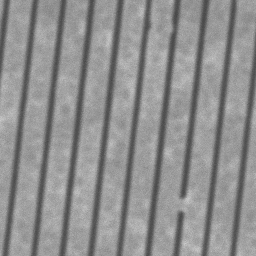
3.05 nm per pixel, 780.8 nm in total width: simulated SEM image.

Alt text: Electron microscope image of parallel lines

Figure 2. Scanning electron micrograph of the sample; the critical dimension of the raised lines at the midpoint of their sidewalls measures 62.5 nanometres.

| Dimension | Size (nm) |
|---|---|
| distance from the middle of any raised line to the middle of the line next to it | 86.2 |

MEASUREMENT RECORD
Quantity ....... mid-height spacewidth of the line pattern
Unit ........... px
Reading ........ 7.8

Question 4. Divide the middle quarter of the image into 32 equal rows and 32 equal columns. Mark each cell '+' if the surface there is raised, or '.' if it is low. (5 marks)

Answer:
++++..+++++..+++++..+++++...++++
++++..+++++..+++++..+++++..+++++
++++..+++++..+++++..+++++..+++++
++++..+++++..+++++..+++++..+++++
++++..+++++..+++++..+++++..+++++
++++.++++++..+++++..+++++..+++++
+++..++++++..+++++..+++++..+++++
+++..+++++...+++++..+++++..+++++
+++..+++++..+++++...+++++..+++++
+++..+++++..+++++..+++++...+++++
+++..+++++..+++++..+++++..+++++.
+++..+++++..+++++..+++++..+++++.
+++..+++++..+++++..+++++..+++++.
+++..+++++..+++++..+++++..+++++.
++...+++++..+++++..+++++..+++++.
++...++++...+++++..+++++..+++++.
++..+++++..+++++...+++++..+++++.
++..+++++..+++++..+++++...+++++.
++..+++++..+++++..+++++..+++++..
++..+++++..+++++..+++++..+++++..
++..+++++..+++++..+++++..+++++..
++..+++++..+++++..+++++..+++++..
++..+++++..+++++..+++++..+++++..
+...+++++..+++++..+++++..+++++..
+..+++++...+++++..+++++..+++++..
+..+++++..+++++...+++++..+++++..
+..+++++..+++++..+++++...+++++..
+..+++++..+++++..+++++..+++++...
+..+++++..+++++..+++++..+++++..+
+..+++++..+++++..+++++..+++++..+
+.++++++..+++++..+++++..+++++..+
+.++++++..+++++..+++++..+++++..+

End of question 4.